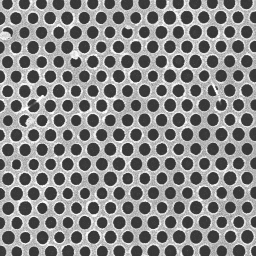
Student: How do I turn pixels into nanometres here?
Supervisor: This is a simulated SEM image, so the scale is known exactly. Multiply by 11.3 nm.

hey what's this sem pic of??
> a regular array of holes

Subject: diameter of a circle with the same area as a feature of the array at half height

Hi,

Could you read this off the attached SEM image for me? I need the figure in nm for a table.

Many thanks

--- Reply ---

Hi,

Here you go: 136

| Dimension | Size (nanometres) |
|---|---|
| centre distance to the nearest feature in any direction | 187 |